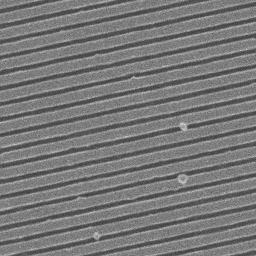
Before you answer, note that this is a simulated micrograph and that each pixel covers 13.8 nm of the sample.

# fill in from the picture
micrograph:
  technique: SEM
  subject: parallel lines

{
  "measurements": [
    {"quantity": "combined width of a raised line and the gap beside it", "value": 210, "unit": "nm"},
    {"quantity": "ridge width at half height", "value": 147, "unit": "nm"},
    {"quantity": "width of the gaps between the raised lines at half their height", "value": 4.89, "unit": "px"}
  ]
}